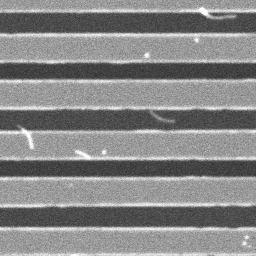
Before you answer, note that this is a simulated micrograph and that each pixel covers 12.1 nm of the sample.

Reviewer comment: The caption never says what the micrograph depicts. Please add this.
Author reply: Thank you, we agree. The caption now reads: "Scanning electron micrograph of lines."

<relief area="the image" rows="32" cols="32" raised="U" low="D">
UUUUUUUUUUUUUUUUUUUUUUUUUUUUUUUU
DDDDDDDDDDUDDDDDDDDDDDDDDUUDDDDD
DDDDDDDDDDDDDDDDDDDDDDDDDDDDDDDD
DDDDDDDDDDDDDDDDDDDDDDDDDDDDDDDD
UUUUUUUUUUUUUUUUUUUUUUUUUUUUUUUU
UUUUUUUUUUUUUUUUUUUUUUUUUUUUUUUU
UUUUUUUUUUUUUUUUUUUUUUUUUUUUUUUU
UUUUUUUUUUUUUUUUUUUUUUUUUUUUUUUU
DDDDDDDDDDDDDDDDDDDDDDDDDDDDDDDD
DDDDDDDDDDDDDDDDDDDDDDDDDDDDDDDD
UUUUUUUUUUUUUUUUUUUUUUUUUUUUUUUU
UUUUUUUUUUUUUUUUUUUUUUUUUUUUUUUU
UUUUUUUUUUUUUUUUUUUUUUUUUUUUUUUU
UUUUUUUUUUUUUUUUUUUUUUUUUUUUUUUU
DDDDDDDDDDDDDDDDDDDDDDDDDDDDDDDD
DDDDDDDDDDDDDDDDDDDDDDDDDDDDDDDD
UUUUUUUUUUUUUUUUUUUUUUUUUUUUUUUU
UUUUUUUUUUUUUUUUUUUUUUUUUUUUUUUU
UUUUUUUUUUUUUUUUUUUUUUUUUUUUUUUU
UUUUUUUUUUUUUUUUUUUUUUUUUUUUUUUU
DDDDDDDDDDDDDDDDDDDDDDDDDDDDDDDD
DDDDDDDDDDDDDDDDDDDDDDDDDDDDDDDD
UUUUUUUUUUUUUUUUUUUUUUUUUUUUUUUU
UUUUUUUUUUUUUUUUUUUUUUUUUUUUUUUU
UUUUUUUUUUUUUUUUUUUUUUUUUUUUUUUU
UUUUUUUUUUUUUUUUUUUUUUUUUUUUUUUU
DDDDDDDDDDDDDDDDDDDDDDDDDDDDDDDD
DDDDDDDDDDDDDDDDDDDDDDDDDDDDDDDD
DDDDDDDDDDDDDDDDDDDDDDDDDDDDDDDD
UUUUUUUUUUUUUUUUUUUUUUUUUUUUUUUU
UUUUUUUUUUUUUUUUUUUUUUUUUUUUUUUU
UUUUUUUUUUUUUUUUUUUUUUUUUUUUUUUU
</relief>